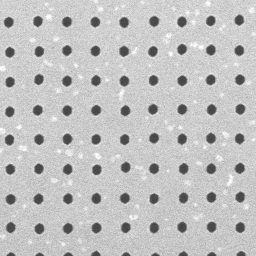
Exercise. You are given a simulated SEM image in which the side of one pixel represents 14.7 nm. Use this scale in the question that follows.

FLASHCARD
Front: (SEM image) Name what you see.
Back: a regular array of holes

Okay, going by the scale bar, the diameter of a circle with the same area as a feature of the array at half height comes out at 0.154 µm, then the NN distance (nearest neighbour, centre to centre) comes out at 416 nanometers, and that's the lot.